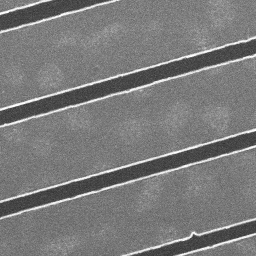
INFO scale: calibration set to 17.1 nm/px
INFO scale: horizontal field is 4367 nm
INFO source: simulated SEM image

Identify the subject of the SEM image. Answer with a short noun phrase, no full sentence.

one or a few lines or trenches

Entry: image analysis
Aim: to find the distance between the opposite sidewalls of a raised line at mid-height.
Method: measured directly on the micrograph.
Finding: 0.279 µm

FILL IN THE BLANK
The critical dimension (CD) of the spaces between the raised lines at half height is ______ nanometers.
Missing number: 1220